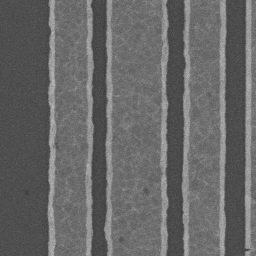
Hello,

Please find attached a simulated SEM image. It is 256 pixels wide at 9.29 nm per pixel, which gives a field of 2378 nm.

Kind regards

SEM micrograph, one or a few lines or trenches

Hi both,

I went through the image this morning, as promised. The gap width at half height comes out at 199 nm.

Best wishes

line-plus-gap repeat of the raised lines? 621 nanometres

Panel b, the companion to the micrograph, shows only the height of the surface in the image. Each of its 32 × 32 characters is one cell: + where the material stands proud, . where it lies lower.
.......++++...+++++++..+++++...+
.......++++...+++++++...++++...+
.......++++...+++++++...++++...+
.......++++...+++++++..+++++...+
.......++++...+++++++..+++++...+
.......++++...+++++++..+++++...+
.......++++...+++++++..+++++...+
.......++++...+++++++..+++++...+
.......++++...++++++....++++...+
.......++++...++++++...+++++...+
.......++++...++++++...+++++...+
.......++++...++++++...+++++...+
.......++++...+++++++..+++++...+
.......++++...+++++++..+++++...+
.......++++...+++++++..+++++...+
.......++++...++++++...+++++...+
.......++++...++++++...+++++...+
.......++++...++++++...+++++...+
.......++++...++++++...+++++...+
.......++++...++++++...+++++...+
.......++++...++++++...+++++...+
.......++++...++++++...+++++...+
......+++++...++++++...+++++...+
......+++++...++++++...+++++...+
......+++++...+++++++..+++++...+
......+++++...+++++++..+++++...+
......+++++...+++++++..+++++...+
......+++++...++++++...+++++...+
......+++++...++++++...+++++...+
......+++++...++++++...+++++...+
.......++++...+++++++..+++++...+
......+++++...++++++...+++++...+